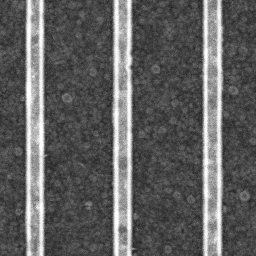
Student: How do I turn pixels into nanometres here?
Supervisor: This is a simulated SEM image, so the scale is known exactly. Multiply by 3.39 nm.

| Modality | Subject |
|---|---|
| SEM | one or a few lines or trenches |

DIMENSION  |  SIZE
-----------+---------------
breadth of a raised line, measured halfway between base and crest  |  42.4 nm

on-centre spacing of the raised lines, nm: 301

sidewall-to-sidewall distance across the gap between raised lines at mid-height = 0.258 µm